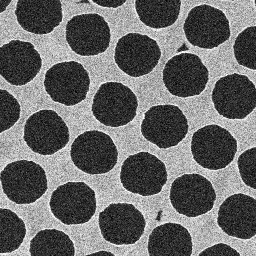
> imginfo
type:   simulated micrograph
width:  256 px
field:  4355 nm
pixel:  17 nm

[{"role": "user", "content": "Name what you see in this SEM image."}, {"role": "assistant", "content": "a regular array of holes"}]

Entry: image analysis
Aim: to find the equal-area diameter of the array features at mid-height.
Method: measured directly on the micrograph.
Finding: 0.778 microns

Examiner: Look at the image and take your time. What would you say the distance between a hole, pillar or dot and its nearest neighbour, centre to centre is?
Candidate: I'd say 0.892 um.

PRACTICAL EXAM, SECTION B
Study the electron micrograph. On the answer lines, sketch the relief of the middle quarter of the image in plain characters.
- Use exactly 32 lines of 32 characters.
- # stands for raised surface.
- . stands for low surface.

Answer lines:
.....########..........##.......
......########........###.......
......##########.....####.......
......###################.......
.......####...###########.......
......###.......#########.......
......##.........#########......
......##..........#########.....
.....##...........############..
....###............############.
#.#####............###......####
#######...........###........###
#######...........##..........##
########..........##...........#
#########........##............#
.#######.##....####............#
.######.###########............#
.###.......########............#
.##.........########..........##
.#..........##########.......###
##...........##########.....####
##...........###################
#.............####....##########
##...........###.......#########
##...........##..........#######
###..........#...........#######
####........##............######
######....####............####..
##############............##....
#....#########............#.....
......#########..........##.....
.......####.####........##......